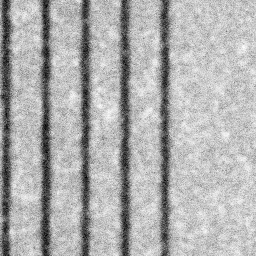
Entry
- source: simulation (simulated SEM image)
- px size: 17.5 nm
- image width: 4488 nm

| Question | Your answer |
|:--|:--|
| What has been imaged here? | parallel lines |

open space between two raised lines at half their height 31.1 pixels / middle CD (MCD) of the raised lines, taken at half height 8.5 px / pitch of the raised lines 696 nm